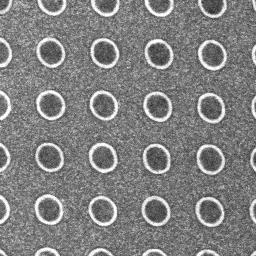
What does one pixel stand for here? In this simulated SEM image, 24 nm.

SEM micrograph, a regular array of raised bodies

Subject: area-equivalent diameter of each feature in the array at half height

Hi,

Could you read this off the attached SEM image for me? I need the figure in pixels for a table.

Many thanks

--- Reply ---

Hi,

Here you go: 26.3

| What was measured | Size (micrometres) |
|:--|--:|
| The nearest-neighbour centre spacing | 1.25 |